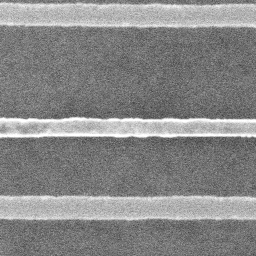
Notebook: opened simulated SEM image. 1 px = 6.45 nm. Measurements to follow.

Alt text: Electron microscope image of lines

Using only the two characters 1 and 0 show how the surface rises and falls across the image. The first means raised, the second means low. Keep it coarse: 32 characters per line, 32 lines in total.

00000000000000000000000000000000
00000000000000000000000000000000
00000000000000000000000000000000
00000000000000000000000000000000
00000000000000000000000000000000
00000000000000000000000000000000
00000000000000000000000000000000
00000000000000000000000000000000
00000000000000000000000000000000
00000000000000000000000000000000
00000000000000000000000000000000
00000000000000000000000000000000
00000000000000000000000000000000
00000000000000000000000000000000
00000000000000000000000000000000
11111111111111111111111111111111
11111111111111111111111111111111
00000000000000000000000000000000
00000000000000000000000000000000
00000000000000000000000000000000
00000000000000000000000000000000
00000000000000000000000000000000
00000000000000000000000000000000
00000000000000000000000000000000
00000000000000000000000000000000
00000000000000000000000000000000
00000000000000000000000000000000
00000000000000000000000000000000
00000000000000000000000000000000
00000000000000000000000000000000
00000000000000000000000000000000
00000000000000000000000000000000